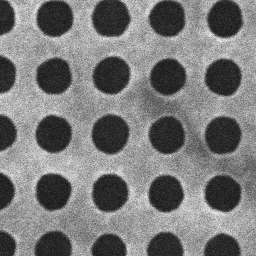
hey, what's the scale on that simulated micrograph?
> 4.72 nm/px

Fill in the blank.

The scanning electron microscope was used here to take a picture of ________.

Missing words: a regular array of holes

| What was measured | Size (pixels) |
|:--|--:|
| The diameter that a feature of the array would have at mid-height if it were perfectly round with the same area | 37.4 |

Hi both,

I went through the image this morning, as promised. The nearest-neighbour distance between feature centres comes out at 0.265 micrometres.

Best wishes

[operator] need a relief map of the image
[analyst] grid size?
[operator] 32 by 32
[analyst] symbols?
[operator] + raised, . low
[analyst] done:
.++++...++++....+++....++++...++
..+++....+++....+++....+++....++
..+++....++.....+++....+++....++
..+++....+++....+++....+++....++
++++++..+++++..+++++..+++++..+++
++++++++++++++++++++++++++++++++
++++++++++++++++++++++++++++++++
.+++++..+++++..+++++..+++++..+++
..+++....+++....+++....+++....++
..++.....+++....+++....+++....++
..+++....+++....+++....+++....++
.+++++..+++++..+++++..+++++..+++
++++++++++++++++++++++++++++++++
++++++++++++++++++++++++++++++++
.+++++.++++++..+++++++++++++++++
..+++....+++....+++....+++....++
..+++....++.....+++....+++....++
..+++....+++....+++....+++....++
.++++...++++...++++....+++....++
++++++++++++++++++++++++++++++++
++++++++++++++++++++++++++++++++
++++++++++++++++++++++++++++++++
.++++...++++...++++...++++...+++
..++.....+++....+++....+++....++
..+++....+++....+++....+++....++
.++++...++++....+++....+++....++
+++++++++++++.++++++.+++++++++++
++++++++++++++++++++++++++++++++
++++++++++++++++++++++++++++++++
.++++...+++++..++++...+++++..+++
..++.....+++....+++....+++....++
..++.....++.....++.....++.....++